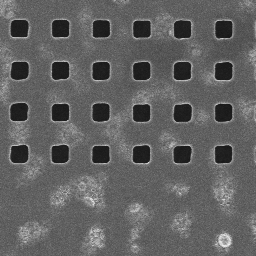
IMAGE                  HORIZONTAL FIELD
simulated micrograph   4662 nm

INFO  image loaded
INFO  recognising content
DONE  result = a regular array of holes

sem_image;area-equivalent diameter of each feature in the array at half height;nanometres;354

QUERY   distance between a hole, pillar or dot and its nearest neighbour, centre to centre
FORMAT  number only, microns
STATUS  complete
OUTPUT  0.74